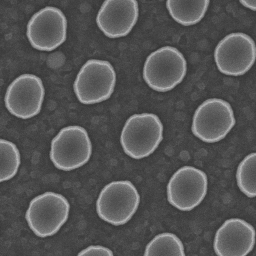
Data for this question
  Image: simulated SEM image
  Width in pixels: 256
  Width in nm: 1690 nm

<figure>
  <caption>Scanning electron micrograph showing a regular array of raised bodies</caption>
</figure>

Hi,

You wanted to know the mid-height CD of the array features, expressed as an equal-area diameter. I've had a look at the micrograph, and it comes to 268 nm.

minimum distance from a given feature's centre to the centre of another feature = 463 nm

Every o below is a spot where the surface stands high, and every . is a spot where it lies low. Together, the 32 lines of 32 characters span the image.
.............oooo....ooooo.....o
.....oo.....ooooo....ooooo......
....oooo....ooooo.....ooo.......
....oooo.....ooo................
....oooo......o..............oo.
....ooo.....................oooo
...................ooo.....ooooo
..................ooooo....ooooo
..........oooo....ooooo....oooo.
...o......oooo....ooooo.........
..ooo....ooooo.....ooo..........
.oooo.....oooo..................
.oooo.....ooo...................
.oooo....................oooo...
..oo.............oo.....ooooo...
................oooo....ooooo...
........ooo....ooooo....oooo....
.......oooo....ooooo......o.....
oo....ooooo.....ooo.............
oo....ooooo......o.............o
oo.....ooo....................oo
oo....................ooo.....oo
.....................ooooo....oo
.............oooo....ooooo....oo
.....oo.....ooooo....oooo.......
....oooo....ooooo.....ooo.......
...ooooo....ooooo...............
....oooo.....ooo.............o..
....ooo.....................ooo.
....................oo.....ooooo
...................oooo....ooooo
..........oooo....ooooo....oooo.